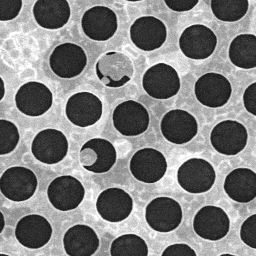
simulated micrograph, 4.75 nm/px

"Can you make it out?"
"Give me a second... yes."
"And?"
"a regular array of holes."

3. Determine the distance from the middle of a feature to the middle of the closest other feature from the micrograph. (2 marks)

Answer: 48.7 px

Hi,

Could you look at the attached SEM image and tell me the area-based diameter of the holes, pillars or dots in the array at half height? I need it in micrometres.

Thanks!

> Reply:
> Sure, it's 0.174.